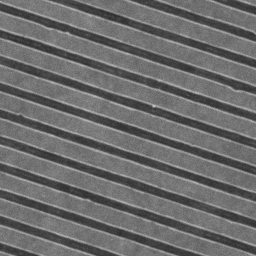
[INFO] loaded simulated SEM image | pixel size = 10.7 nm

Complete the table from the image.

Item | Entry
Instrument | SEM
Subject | parallel lines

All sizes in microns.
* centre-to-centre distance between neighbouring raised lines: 0.27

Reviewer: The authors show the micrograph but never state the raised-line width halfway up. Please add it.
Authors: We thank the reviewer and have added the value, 175 nm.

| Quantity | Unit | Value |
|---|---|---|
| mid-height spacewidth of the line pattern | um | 0.0924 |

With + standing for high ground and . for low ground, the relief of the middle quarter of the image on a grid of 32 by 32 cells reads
+++++.......+++++++++++++.......
++++++++.......+++++++++++++....
+++++++++++.......++++++++++++++
.+++++++++++++........++++++++++
....+++++++++++++........+++++++
.......+++++++++++++.......+++++
+++.......++++++++++++++......++
+++++++......++++++++++++++.....
+++++++++........+++++++++++++..
++++++++++++........++++++++++++
..+++++++++++++........+++++++++
.....+++++++++++++........++++++
+.......+++++++++++++........+++
++++.......++++++++++++++.......
+++++++.......+++++++++++++.....
++++++++++.......++++++++++++++.
+++++++++++++.......++++++++++++
...+++++++++++++.......+++++++++
......+++++++++++++.......++++++
++.......+++++++++++++.......+++
+++++.......+++++++++++++.......
++++++++.......+++++++++++++....
+++++++++++.......+++++++++++++.
.+++++++++++++.......+++++++++++
....+++++++++++++.......++++++++
.......+++++++++++++.......+++++
+++.......++++++++++++++......++
++++++.......++++++++++++++.....
+++++++++........+++++++++++++..
+++++++++++++.......++++++++++++
..++++++++++++++.......+++++++++
......++++++++++++.......+++++++